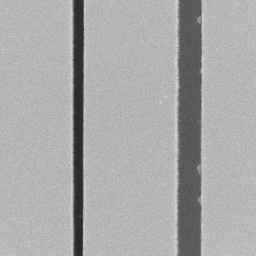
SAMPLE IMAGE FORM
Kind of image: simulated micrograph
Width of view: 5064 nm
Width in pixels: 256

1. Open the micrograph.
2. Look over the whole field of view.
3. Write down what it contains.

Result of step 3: lines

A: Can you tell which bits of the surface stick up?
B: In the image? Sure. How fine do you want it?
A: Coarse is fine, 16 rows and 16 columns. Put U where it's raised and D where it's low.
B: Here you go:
UUUUUUUUUUUDDUUU
UUUUUUUUUUUDDUUU
UUUUUUUUUUUDDUUU
UUUUUUUUUUUDDUUU
UUUUUUUUUUUDDUUU
UUUUUUUUUUUDDUUU
UUUUUUUUUUUDDUUU
UUUUUUUUUUUDDUUU
UUUUUUUUUUUDDUUU
UUUUUUUUUUUDDUUU
UUUUUUUUUUUDDUUU
UUUUUUUUUUUDDUUU
UUUUUUUUUUUDDUUU
UUUUUUUUUUUDDUUU
UUUUUUUUUUUDDUUU
UUUUUUUUUUUDDUUU